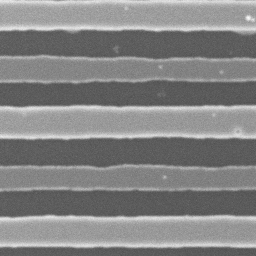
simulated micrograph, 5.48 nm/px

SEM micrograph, lines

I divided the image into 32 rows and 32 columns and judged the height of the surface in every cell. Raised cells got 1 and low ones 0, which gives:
11111111111111111111111111111111
11111111111111111111111111111111
11111111111111111111111111111111
11111111111111111111111111111111
00000000000000000000000000000000
00000000000000000000000000000000
00000000000000000000000000000000
11111111111111111111111111111111
11111111111111111111111111111111
11111111111111111111111111111111
00000000000000000000000000000000
00000000000000000000000000000000
00000000000000000000000000000000
11111111111111111111111111111111
11111111111111111111111111111111
11111111111111111111111111111111
11111111111111111111111111111111
00000000000000000000000000000000
00000000000000000000000000000000
00000000000000000000000000000000
00000000000000000000000000000000
11111111111111111111111111111111
11111111111111111111111111111111
11111111111111111111111111111111
00000000000000000000000000000000
00000000000000000000000000000000
00000000000000000000000000000000
11111111111111111111111111111111
11111111111111111111111111111111
11111111111111111111111111111111
11111111111111111111111111111111
00000000000000000000000000000000